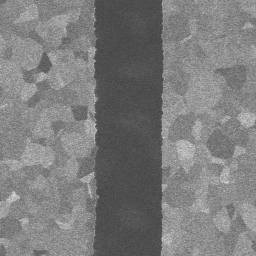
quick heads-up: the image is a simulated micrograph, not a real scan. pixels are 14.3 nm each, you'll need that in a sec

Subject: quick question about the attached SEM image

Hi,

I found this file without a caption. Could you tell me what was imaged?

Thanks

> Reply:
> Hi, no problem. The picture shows one or a few lines or trenches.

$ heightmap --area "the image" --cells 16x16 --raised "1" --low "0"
1111110000111111
1111110000111111
1111110000111111
1111110000111111
1111110000111111
1111110000111111
1111110000111111
1111110000111111
1111110000111111
1111110000111111
1111110000111111
1111110000111111
1111110000111111
1111110000111111
1111110000111111
1111110000111111